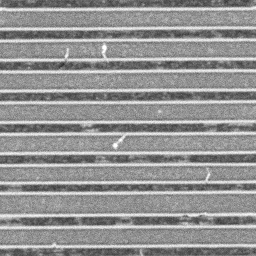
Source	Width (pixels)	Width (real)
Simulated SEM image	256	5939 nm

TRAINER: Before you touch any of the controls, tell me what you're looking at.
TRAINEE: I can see parallel lines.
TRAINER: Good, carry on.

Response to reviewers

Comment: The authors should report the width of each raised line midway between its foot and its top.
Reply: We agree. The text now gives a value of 276 nm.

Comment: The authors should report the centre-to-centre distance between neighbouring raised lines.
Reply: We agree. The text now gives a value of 722 nm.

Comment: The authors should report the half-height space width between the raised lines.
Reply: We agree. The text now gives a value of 438 nm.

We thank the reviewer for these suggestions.